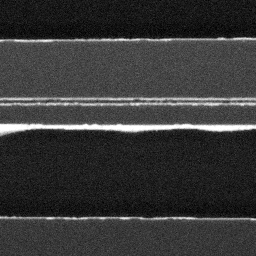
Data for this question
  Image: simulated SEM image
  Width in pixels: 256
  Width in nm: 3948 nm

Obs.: lines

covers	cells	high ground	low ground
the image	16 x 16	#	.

................
................
........########
################
################
################
################
################
................
................
................
................
................
................
################
################